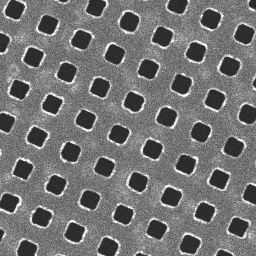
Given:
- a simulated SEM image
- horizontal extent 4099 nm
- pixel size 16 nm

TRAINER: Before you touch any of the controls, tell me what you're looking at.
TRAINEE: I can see a regular array of holes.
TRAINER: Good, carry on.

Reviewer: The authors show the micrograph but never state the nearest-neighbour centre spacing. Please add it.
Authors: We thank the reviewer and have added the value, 569 nanometres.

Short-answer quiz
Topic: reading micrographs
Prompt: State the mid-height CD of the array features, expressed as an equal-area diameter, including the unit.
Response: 0.306 um